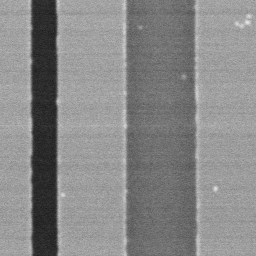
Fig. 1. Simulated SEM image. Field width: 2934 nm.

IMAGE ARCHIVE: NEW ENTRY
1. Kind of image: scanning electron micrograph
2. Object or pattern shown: lines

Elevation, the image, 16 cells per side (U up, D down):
UUDDUUUUDDDDUUUU
UUDDUUUUDDDDUUUU
UUDDUUUUDDDDUUUU
UUDDUUUUDDDDUUUU
UUDDUUUUDDDDUUUU
UUDDUUUUDDDDUUUU
UUDDUUUUDDDDUUUU
UUDDUUUUDDDDUUUU
UUDDUUUUDDDDUUUU
UUDDUUUUDDDDUUUU
UUDDUUUUDDDDUUUU
UUDDUUUUDDDDUUUU
UUDDUUUUDDDDUUUU
UUDDUUUUDDDDUUUU
UUDDUUUUDDDDUUUU
UUDDUUUUDDDDUUUU